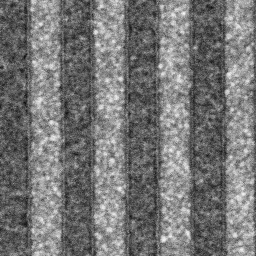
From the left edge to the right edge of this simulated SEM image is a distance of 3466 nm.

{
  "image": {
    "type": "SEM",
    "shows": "one or a few lines or trenches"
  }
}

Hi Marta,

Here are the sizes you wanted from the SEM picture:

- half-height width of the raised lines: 392 nanometres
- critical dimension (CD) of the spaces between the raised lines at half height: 35 pixels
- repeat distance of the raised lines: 880 nanometers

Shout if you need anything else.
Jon